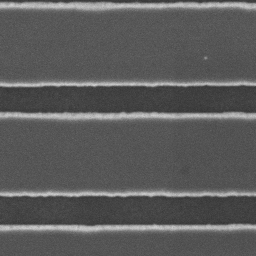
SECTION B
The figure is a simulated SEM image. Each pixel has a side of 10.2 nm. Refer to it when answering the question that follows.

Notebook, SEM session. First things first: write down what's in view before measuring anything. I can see lines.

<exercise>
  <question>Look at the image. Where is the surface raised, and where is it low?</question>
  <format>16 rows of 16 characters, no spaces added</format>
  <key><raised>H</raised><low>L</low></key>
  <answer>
HHHHHHHHHHHHHHHH
HHHHHHHHHHHHHHHH
HHHHHHHHHHHHHHHH
HHHHHHHHHHHHHHHH
HHHHHHHHHHHHHHHH
LLLLLLLLLLLLLLLL
LLLLLLLLLLLLLLLL
HHHHHHHHHHHHHHHH
HHHHHHHHHHHHHHHH
HHHHHHHHHHHHHHHH
HHHHHHHHHHHHHHHH
HHHHHHHHHHHHHHHH
LLLLLLLLLLLLLLLL
LLLLLLLLLLLLLLLL
HHHHHHHHHHHHHHHH
HHHHHHHHHHHHHHHH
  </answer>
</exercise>